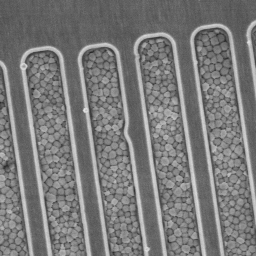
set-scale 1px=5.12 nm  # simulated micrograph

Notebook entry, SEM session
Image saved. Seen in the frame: parallel lines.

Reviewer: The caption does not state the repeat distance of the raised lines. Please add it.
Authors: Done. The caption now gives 292 nanometers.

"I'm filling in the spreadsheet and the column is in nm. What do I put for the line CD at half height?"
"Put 99.5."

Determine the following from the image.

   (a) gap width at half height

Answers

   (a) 191 nm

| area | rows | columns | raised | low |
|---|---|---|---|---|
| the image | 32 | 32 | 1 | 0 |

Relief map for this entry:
11111111111111111111111111111111
11111111111111111111111111111111
11111111111111111111111111111111
11111111111111111111111110001110
11111111111111111110011100000110
11111111111111111000001100000110
11110001110000111000001100000110
11100000110000011000001100000111
11100000110000011000001110000111
01100000110000011000001110000111
01100000110000011100001110000011
01100000111000011100000110000011
01110000111000011100000110000011
01110000111000001100000110000011
01110000011000001100000110000011
00110000011000001100000111000011
00110000011000001100000111000011
00110000011000001110000111000001
00110000011100001110000011000001
00111000011100001110000011000001
00111000011100000110000011000001
00111000001100000110000011000001
00011000001100000110000011100001
00011000001100000110000011100001
00011000001100000111000011100000
00011000001110000111000001100000
00011100001110000111000001100000
00011100001110000011000001100000
00011100000110000011000001100000
00001100000110000011000001110000
00001100000110000011000001110000
00001100000110000011100001110000